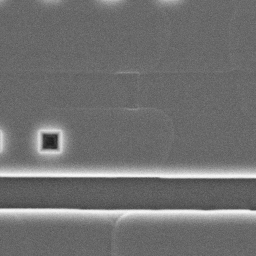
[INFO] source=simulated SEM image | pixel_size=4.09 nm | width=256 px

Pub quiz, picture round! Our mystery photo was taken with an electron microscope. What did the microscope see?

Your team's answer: wiring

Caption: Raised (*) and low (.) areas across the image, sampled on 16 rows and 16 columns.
****************
****************
****************
****************
****************
****************
****************
****************
****************
****************
****************
................
................
****************
****************
****************